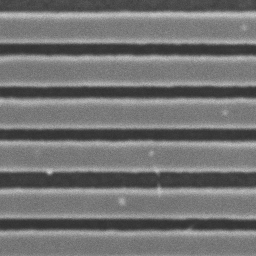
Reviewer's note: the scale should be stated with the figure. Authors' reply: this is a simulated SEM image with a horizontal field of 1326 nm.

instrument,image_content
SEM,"lines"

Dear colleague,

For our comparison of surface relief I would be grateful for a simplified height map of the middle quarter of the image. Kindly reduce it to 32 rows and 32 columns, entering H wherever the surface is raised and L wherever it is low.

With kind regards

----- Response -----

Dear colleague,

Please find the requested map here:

HHHHHHHHHHHHHHHHHHHHHHHHHHHHHHHH
HHHHHHHHHHHHHHHHHHHHHHHHHHHHHHHH
HHHHHHHHHHHHHHHHHHHHHHHHHHHHHHHH
HHHHHHHHHHHHHHHHHHHHHHHHHHHHHHHH
HHHHHHHHHHHHHHHHHHHHHHHHHHHHHHHH
LLLLLLLLLLLLLLLLLLLLLLLLLHHLLLLL
LLLLLLLLLLLLLLLLLLLLLLLLLLLLLLLL
LLLLLLLLLLLLLLLLLLLLLLLLLLLLLLLL
LLLLLHHHHHLLLHLHHLLLLLLLLLLLHHHL
HHHHHHHHHHHHHHHHHHHHHHHHHHHHHHHH
HHHHHHHHHHHHHHHHHHHHHHHHHHHHHHHH
HHHHHHHHHHHHHHHHHHHHHHHHHHHHHHHH
HHHHHHHHHHHHHHHHHHHHHHHHHHHHHHHH
HHHHHHHHHHHHHHHHHHHHHHHHHHHHHHHH
HHHHHHHHHHHHHHHHHHHHHHHHHHHHHHHH
HHHHHHHHHHHHHHHHHHHHHHHHHHHHHHHH
LLLLLLLLLLLLLLLLLLLLLLLLLLLLLLLL
LLLLLLLLLLLLLLLLLLLLLLLLLLLLLLLL
LLLLLLLLLLLLLLLLLLLLLLLLLLLLLLLL
HHHHHHHHHHHHHHHHHHHHHHHHHHHHHHHH
HHHHHHHHHHHHHHHHHHHHHHHHHHHHHHHH
HHHHHHHHHHHHHHHHHHHHHHHHHHHHHHHH
HHHHHHHHHHHHHHHHHHHHHHHHHHHHHHHH
HHHHHHHHHHHHHHHHHHHHHHHHHHHHHHHH
HHHHHHHHHHHHHHHHHHHHHHHHHHHHHHHH
HHHHHHHHHHHHHHHHHHHHHHHHHHHHHHHH
HHHHHHHHHHHHHHHHHHHHHHHHHHHHHHHH
LLLLLLLLLLLLLLLLLLLLLLLLLLLLLLLL
LLLLLLLLLLLLLLLLLLLLLLLLLLLLLLLL
LLLLLLLLLLLLLLLLLLLLLLLLLLLLLLLL
LLLLLLLLLLLLLLLLLLLLLLLLLLLLLLLL
HHHHHHHHHHHHHHHHHHHHHHHHHHHHHHHH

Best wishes